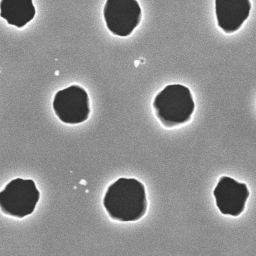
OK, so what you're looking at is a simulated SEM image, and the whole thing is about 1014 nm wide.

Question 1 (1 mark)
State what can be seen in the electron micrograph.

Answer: holes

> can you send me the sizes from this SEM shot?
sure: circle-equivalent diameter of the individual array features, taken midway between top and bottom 151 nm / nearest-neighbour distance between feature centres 412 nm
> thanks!